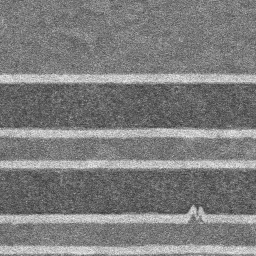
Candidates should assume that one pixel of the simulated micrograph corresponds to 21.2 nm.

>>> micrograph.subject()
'one or a few lines or trenches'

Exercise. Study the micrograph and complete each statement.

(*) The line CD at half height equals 685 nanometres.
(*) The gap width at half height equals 1140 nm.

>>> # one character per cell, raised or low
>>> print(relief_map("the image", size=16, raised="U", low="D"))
UUUUUUUUUUUUUUUU
UUUUUUUUUUUUUUUU
UUUUUUUUUUUUUUUU
UUUUUUUUUUUUUUUU
UUUUUUUUUUUUUUUU
DDDDDDDDDDDDDDDD
DDDDDDDDDDDDDDDD
DDDDDDDDDDDDDDDD
UUUUUUUUUUUUUUUU
UUUUUUUUUUUUUUUU
DDDDDDDDDDDDDDDD
DDDDDDDDDDDDDDDD
DDDDDDDDDDDDDDDD
DDDDDDDDDDDDUDDD
UUUUUUUUUUUUUUUU
UUUUUUUUUUUUUUUU